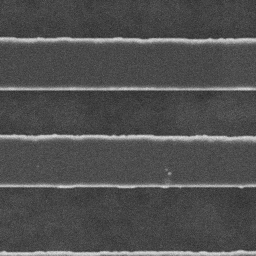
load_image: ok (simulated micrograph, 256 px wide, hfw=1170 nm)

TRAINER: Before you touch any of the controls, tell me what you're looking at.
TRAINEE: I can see lines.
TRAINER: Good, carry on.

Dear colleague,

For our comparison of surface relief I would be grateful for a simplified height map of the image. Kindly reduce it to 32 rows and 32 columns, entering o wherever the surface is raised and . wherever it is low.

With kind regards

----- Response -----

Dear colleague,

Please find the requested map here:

................................
................................
................................
................................
................................
oooooooooooooooooooooooooooooooo
oooooooooooooooooooooooooooooooo
oooooooooooooooooooooooooooooooo
oooooooooooooooooooooooooooooooo
oooooooooooooooooooooooooooooooo
oooooooooooooooooooooooooooooooo
................................
................................
................................
................................
................................
................................
oooooooooooooooooooooooooooooooo
oooooooooooooooooooooooooooooooo
oooooooooooooooooooooooooooooooo
oooooooooooooooooooooooooooooooo
oooooooooooooooooooooooooooooooo
oooooooooooooooooooooooooooooooo
................................
................................
................................
................................
................................
................................
................................
................................
......ooo....o.o..o.ooo......ooo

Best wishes